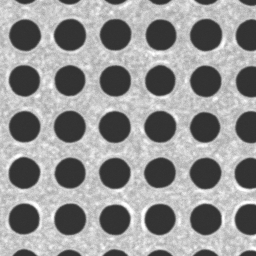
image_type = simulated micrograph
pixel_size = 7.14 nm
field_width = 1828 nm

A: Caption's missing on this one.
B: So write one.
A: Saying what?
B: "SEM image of a regular array of holes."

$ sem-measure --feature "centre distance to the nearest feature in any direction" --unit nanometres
322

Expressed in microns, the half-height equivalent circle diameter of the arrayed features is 0.227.